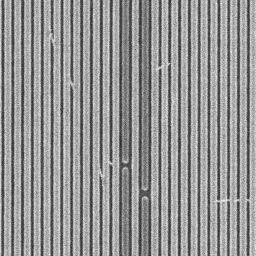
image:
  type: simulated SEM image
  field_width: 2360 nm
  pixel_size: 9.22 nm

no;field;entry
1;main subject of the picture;parallel lines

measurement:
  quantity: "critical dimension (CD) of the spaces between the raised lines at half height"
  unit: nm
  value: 33.4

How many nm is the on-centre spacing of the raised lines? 90.6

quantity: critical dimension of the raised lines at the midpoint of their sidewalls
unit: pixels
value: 6.25